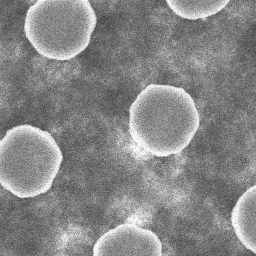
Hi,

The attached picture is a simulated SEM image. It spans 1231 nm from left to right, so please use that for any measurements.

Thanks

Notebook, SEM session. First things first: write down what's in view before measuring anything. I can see raised bodies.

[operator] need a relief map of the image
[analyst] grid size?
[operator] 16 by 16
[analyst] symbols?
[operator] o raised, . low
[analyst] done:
..oooo.....ooo..
..oooo..........
..oooo..........
...oo...........
................
.........oo.....
........oooo....
........oooo....
ooo.....oooo....
oooo.....oo.....
oooo............
ooo.............
...............o
...............o
.......oo......o
......oooo......